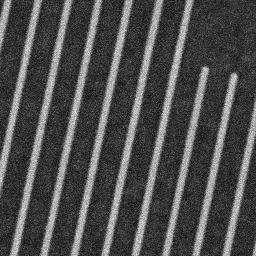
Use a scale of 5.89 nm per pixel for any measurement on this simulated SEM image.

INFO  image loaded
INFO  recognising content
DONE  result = parallel lines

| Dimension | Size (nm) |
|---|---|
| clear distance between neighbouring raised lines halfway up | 142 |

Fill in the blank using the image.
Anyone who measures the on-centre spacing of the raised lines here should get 174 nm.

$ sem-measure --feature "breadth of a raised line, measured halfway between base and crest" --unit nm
29.5